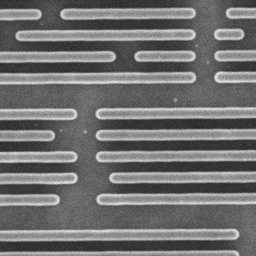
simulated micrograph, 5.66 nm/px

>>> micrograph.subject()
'groups of lines, slits or small figures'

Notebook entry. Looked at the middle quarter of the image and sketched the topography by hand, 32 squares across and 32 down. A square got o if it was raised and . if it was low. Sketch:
................................
................................
oooooooooooooooooooooooooooooooo
oooooooooooooooooooooooooooooooo
oooooooooooooooooooooooooo.ooooo
................................
................................
................................
................................
................................
................................
ooo......ooooooooooooooooooooooo
ooo.....oooooooooooooooooooooooo
ooo......oooooooooooooo.........
................................
................................
.............ooo.......ooooooooo
........oooooooooooooooooooooooo
........oooooooooooooooooooooooo
................................
................................
................................
ooo.....oooooooooooooooooooooooo
ooo.....oooooooooooooooooooooooo
................................
................................
................................
ooo.........oooooooooooooooooooo
ooo........ooooooooooooooooooooo
ooo.........ooooooo...ooooooooo.
................................
................................